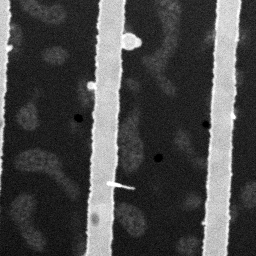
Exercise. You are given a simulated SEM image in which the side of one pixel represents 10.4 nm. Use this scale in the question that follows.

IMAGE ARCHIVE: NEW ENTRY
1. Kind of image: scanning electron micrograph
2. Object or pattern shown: one or a few lines or trenches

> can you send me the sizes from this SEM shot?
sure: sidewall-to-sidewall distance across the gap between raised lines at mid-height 945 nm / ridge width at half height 236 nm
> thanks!